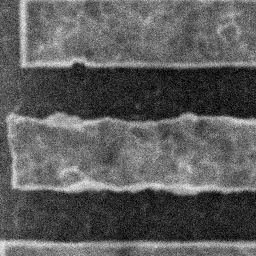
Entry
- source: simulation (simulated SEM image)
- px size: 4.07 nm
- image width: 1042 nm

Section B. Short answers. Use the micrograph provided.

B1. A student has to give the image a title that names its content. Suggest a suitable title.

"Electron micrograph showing one or a few lines or trenches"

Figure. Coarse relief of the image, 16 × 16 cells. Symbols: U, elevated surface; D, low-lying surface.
DUUUUUUUUUUUUUUU
DUUUUUUUUUUUUUUU
DUUUUUUUUUUUUUUU
DUUUUUUUUUUUUUUU
DDDDDDDDDDDDDDDD
DDDDDDDDDDDDDDDD
DDDDDDDDDDDDDDDD
DUDDDDUDDDUUUUUU
DUUUUUUUUUUUUUUU
DUUUUUUUUUUUUUUU
DUUUUUUUUUUUUUUU
DUUUUUUUUUUUUUUU
DDDDDDDDDDDDDDDD
DDDDDDDDDDDDDDDD
DDDDDDDDDDDDDDDD
UUUUUUUUUUUUUUUU